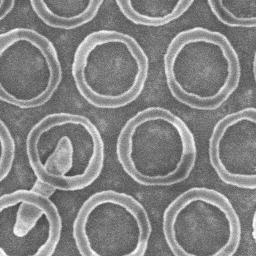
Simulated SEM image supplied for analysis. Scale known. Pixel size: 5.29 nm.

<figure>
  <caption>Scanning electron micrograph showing ring-shaped raised bodies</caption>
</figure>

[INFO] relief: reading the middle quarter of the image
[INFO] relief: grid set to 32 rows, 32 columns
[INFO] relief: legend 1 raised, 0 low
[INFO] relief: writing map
00111000000000000001100001100000
00111000000000000001100000100000
00111000000000000011100000100000
00011000000000000011000000110000
00011000000000000011000000110000
00011100000000000111000000111000
00001110000000001110000000011100
00001111000000011110000000011111
00000111111111111100000000001111
00000001111111110000000000000011
00000000111111000000000000000001
00000000000000000000011110000000
00000000000000000011111111100000
11111000000000000111111111110000
10111100000000001111000000011100
00000110000000011100000000001110
00000011000000011100000000000110
00000001100000111000000000000111
10000001100000111000000000000111
11000001110000111000000000000011
11000000110001111000000000000011
11000000110001111000000000000011
11000001110001111000000000000011
11000001110000111000000000000111
11000011110000111000000000000111
11000011110000011000000000001111
10000111100000011100000000001111
00000111100000001110000000111110
11111111000000000111111111111100
11111110000000000001111111110000
11111000000000000000000000000000
00000000000000000000000000000001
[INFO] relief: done